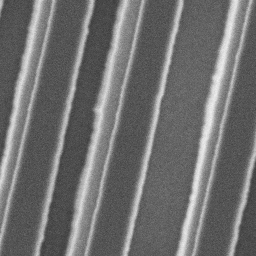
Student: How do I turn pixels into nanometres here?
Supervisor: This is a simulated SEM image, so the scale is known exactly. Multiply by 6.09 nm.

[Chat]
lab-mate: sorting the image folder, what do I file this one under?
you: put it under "lines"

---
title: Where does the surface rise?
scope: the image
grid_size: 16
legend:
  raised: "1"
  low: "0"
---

0011110011100001
0011100111100011
0011100111100011
0011100111100011
0111100111000011
0111100111000011
0111001111000111
0111001111000111
0111001111000111
1111001110000111
1111001110001111
1110011110001111
1110011110001110
1110011100001110
1110011100001110
1100111100011110